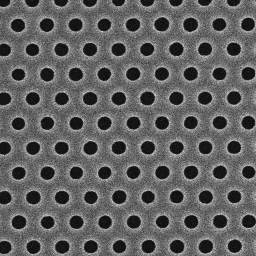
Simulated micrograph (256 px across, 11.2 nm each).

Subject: a regular array of holes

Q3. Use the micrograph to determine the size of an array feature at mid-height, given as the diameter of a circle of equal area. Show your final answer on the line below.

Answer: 154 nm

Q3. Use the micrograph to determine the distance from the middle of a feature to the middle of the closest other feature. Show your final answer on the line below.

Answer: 316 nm